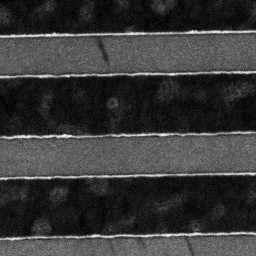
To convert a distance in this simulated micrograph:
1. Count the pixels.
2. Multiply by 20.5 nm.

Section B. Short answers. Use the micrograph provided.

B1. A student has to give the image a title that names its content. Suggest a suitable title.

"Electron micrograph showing one or a few lines or trenches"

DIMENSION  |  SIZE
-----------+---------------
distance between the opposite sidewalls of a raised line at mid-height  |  1250 nanometres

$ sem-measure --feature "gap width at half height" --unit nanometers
809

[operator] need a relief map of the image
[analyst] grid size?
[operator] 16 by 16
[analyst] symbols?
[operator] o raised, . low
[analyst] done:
oooooooooooooooo
oooooooooooooooo
................
................
..............oo
oooooooooooooooo
oooooooooooooooo
oooooooooooooooo
ooooooo.........
................
................
oooooooooooooooo
oooooooooooooooo
oooooooooooooooo
oooooooooooooooo
................